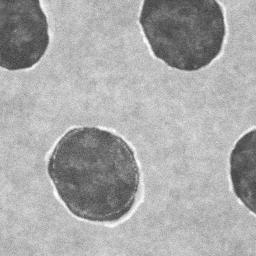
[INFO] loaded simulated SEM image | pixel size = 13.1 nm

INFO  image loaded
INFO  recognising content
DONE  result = holes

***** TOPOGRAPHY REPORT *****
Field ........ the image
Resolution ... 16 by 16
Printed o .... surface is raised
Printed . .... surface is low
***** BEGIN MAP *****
...oooooo.....oo
...oooooo.....oo
...oooooo.....oo
...ooooooo....oo
oooooooooooooooo
oooooooooooooooo
oooooooooooooooo
oooooooooooooooo
oooo...oooooooo.
ooo.....oooooo..
ooo......ooooo..
ooo......oooooo.
oooo.....oooooo.
ooooo...oooooooo
oooooooooooooooo
oooooooooooooooo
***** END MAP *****